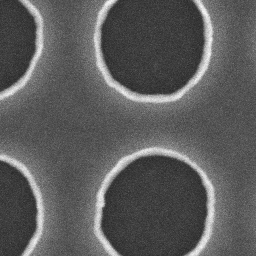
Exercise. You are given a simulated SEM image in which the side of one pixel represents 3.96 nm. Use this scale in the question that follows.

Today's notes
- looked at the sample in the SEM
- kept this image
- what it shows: holes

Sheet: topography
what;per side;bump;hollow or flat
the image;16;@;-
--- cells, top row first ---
--@@@@@-----@@@@
--@@@@-------@@@
--@@@@-------@@@
--@@@@-------@@@
--@@@@@-----@@@@
-@@@@@@@---@@@@@
@@@@@@@@@@@@@@@@
@@@@@@@@@@@@@@@@
@@@@@@@@@@@@@@@@
@@@@@@@@@@@@@@@@
-@@@@@@@----@@@@
--@@@@@------@@@
--@@@@-------@@@
--@@@@-------@@@
--@@@@-------@@@
--@@@@@-----@@@@